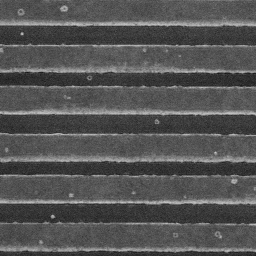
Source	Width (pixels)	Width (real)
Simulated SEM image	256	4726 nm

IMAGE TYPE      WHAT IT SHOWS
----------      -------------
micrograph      lines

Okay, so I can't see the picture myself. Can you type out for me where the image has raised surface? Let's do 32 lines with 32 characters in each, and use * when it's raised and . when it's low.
********************************
********************************
********************************
................................
................................
................................
********************************
********************************
********************************
................................
................................
********************************
********************************
********************************
................................
................................
................................
********************************
********************************
********************************
................................
................................
********************************
********************************
********************************
................................
................................
................................
********************************
********************************
********************************
................................